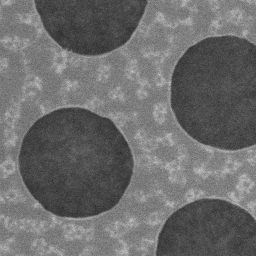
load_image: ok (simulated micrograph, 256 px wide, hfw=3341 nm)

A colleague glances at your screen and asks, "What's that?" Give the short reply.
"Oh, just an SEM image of holes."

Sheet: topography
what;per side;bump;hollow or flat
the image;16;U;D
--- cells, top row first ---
UUDDDDDDDUUUUUUU
UUUDDDDDDUUUUUUU
UUUDDDDDUUUUUDDU
UUUUUDUUUUUDDDDD
UUUUUUUUUUUDDDDD
UUUUUUUUUUUDDDDD
UUUUUUUUUUUDDDDD
UUDDDDDUUUUDDDDD
UUDDDDDDUUUUDDDD
UDDDDDDDUUUUUUUU
UDDDDDDDUUUUUUUU
UUDDDDDDUUUUUUUU
UUDDDDDUUUUUDDUU
UUUUDDUUUUUDDDDD
UUUUUUUUUUDDDDDD
UUUUUUUUUUDDDDDD